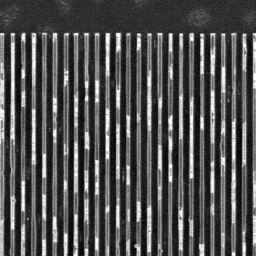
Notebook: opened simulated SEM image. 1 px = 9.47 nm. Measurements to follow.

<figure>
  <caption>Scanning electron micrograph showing parallel lines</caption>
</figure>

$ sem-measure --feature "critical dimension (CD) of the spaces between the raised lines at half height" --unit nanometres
71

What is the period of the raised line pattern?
10.5 px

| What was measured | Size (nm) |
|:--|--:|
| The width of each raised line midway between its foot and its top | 27.2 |